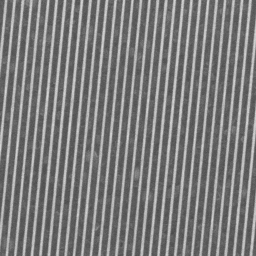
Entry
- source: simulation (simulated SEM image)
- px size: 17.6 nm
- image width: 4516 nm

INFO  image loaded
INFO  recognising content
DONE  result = parallel lines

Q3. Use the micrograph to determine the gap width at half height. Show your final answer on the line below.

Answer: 121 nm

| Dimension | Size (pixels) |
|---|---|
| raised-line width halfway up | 1.62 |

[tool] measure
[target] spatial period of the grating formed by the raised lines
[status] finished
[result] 148 nm